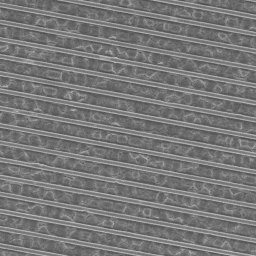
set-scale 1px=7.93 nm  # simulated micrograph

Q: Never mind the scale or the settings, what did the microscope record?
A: parallel lines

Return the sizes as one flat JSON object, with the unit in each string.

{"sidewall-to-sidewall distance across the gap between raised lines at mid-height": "100 nm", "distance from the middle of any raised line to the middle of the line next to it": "0.134 µm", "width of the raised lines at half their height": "29.3 nm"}